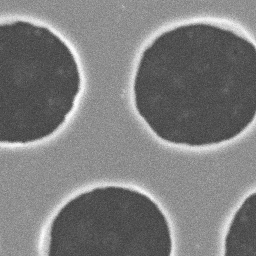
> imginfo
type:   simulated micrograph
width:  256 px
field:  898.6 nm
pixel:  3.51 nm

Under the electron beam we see holes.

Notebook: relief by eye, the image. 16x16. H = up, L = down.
HHHHHHHHHHHHHHHH
LLHHHHHHHHHHLHHH
LLLLHHHHHHLLLLLL
LLLLLHHHHLLLLLLL
LLLLLHHHLLLLLLLL
LLLLLHHHLLLLLLLL
LLLLLHHHHLLLLLLL
LLLLHHHHHLLLLLLL
LLLHHHHHHHLLLLLH
HHHHHHHHHHHHHHHH
HHHHHHHHHHHHHHHH
HHHHHHHHHHHHHHHH
HHHHHLLLLHHHHHHL
HHHHLLLLLLHHHHHL
HHHLLLLLLLLHHHLL
HHHLLLLLLLLHHHLL